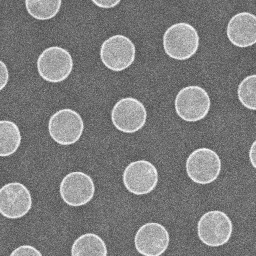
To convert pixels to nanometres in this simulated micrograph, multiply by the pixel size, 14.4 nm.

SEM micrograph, a regular array of raised bodies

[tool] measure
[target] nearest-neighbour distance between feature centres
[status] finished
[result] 912 nanometers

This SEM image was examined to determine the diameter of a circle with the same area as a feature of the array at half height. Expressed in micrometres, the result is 0.492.